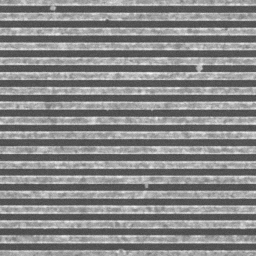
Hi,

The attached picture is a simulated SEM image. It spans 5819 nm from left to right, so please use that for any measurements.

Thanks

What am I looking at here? parallel lines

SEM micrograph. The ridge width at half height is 159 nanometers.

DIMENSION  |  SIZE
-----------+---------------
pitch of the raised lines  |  338 nm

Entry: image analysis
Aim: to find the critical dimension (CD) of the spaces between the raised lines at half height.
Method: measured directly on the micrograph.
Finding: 7.88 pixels